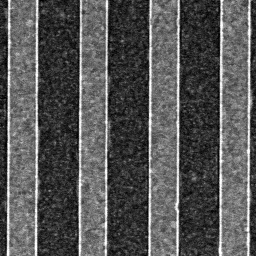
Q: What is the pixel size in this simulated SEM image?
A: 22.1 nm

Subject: one or a few lines or trenches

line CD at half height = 615 nm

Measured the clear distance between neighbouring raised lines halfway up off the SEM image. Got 951 nanometres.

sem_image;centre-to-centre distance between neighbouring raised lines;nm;1560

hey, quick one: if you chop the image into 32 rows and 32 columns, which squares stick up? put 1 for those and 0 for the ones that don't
01111000001110000001110000001110
01111000001110000001110000001110
01111000001110000001110000001110
01111000001110000001110000001110
01111000001110000001110000001110
01111000001110000001110000001110
01111000001110000001110000001110
01111000001110000001110000001110
01111000001110000001110000001110
01111000001110000001110000001110
01111000001110000001110000001110
01111000001110000001110000001110
01110000001110000001110000001110
01110000001110000001110000001110
01110000001110000001110000001110
01110000001110000001110000001110
01111000001110000001110000001110
01111000001110000001110000001110
01111000001110000001110000001110
01111000001110000001110000001110
01111000001110000001110000001110
01111000001110000001110000001110
01111000001110000001110000001110
01111000001110000001110000001110
01111000001110000001110000001110
01111000001110000001110000001110
01110000001110000001110000001110
01110000001110000001110000001110
01110000001110000001110000001110
01110000001110000001110000001110
01110000001110000001110000001110
01110000001110000001110000001110